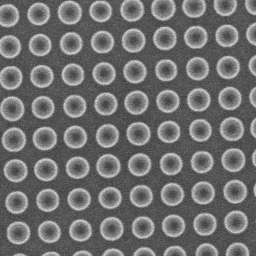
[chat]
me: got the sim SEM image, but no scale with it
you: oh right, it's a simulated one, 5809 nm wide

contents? an array of small figures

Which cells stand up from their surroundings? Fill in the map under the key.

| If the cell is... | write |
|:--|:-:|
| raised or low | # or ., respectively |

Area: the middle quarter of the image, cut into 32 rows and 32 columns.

.###....####...#####...#####...#
####...######..#####...#####...#
#####..######..#####...#####...#
#####...#####..#####....###.....
####....####.....##.............
................................
................................
.........###....####....####...#
.####...#####...#####..######..#
#####...#####..######..######..#
#####...#####..######..#####...#
#####...#####...####....###.....
.####....###....................
................................
.........................##.....
..........##....#####...####....
.####...#####...#####...#####...
#####...#####...#####...#####...
######..#####...#####...#####...
#####...#####....####....##.....
.###......##....................
................................
..........................##....
..###....####....####...#####...
.#####..######..######..#####...
.#####..######..######..#####...
.#####..######..#####....####...
.#####...####....###......##....
..#.............................
................................
...................#.....####...
...##.....###....####....####...